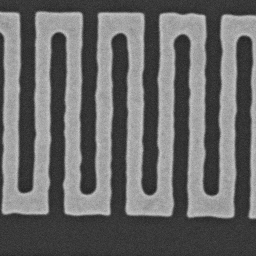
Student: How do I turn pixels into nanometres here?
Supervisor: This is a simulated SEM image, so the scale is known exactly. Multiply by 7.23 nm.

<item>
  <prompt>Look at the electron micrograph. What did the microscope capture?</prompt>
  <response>groups of lines, slits or small figures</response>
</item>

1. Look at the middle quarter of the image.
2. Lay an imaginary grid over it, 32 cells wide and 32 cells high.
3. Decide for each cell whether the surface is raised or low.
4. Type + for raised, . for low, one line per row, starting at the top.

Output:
.+++.....+++....++++....++++....
.+++.....+++....++++....++++....
.+++.....+++....+++.....++++...+
.+++....++++....+++.....+++....+
.+++....++++....+++.....+++....+
.+++....++++....++++....+++....+
.+++....++++....++++....+++.....
++++....++++....++++....+++.....
++++....++++....++++....+++.....
++++....++++....++++....+++....+
.+++....++++....++++....+++.....
.+++....++++....++++....+++.....
++++....++++....++++....+++....+
++++....++++....++++....+++....+
++++....++++....++++....+++....+
++++....++++....++++....+++....+
++++....++++....++++....+++....+
++++....++++....++++....+++.....
++++....++++....+++.....+++....+
++++....++++....+++.....+++....+
++++....++++....++++....+++....+
++++....++++....++++....+++....+
++++....++++....++++....+++....+
++++....++++....+++.....+++....+
++++....++++....+++.....+++....+
++++....+++.....+++....++++....+
++++....++++....+++....++++....+
++++....++++....+++.....+++....+
++++....++++....+++.....+++....+
++++....+++.....+++....++++....+
++++....+++.....+++....++++....+
++++....++++....++++...++++....+